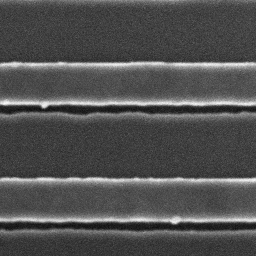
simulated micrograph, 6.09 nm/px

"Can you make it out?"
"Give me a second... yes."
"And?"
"lines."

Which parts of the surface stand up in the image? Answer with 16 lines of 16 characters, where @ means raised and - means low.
----------------
----------------
----------------
----------------
@@@@@@@@@@@@@@@@
@@@@@@@@@@@@@@@@
@-@---@-@@-@@--@
----------------
----------------
----------------
----------------
@@@@@@@@@@@@@@@@
@@@@@@@@@@@@@@@@
@@@@@@@@@@@@@@@@
----------------
----------------